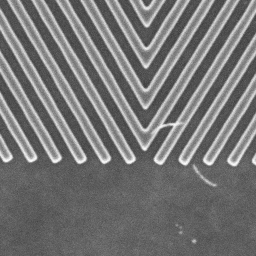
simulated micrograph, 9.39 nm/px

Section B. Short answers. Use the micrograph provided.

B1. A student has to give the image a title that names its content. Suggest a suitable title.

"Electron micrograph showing groups of lines, slits or small figures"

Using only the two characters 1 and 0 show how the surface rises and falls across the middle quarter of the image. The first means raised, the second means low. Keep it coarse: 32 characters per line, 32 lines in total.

00110000110000110000100001100001
00111000111000111000000011100011
00011100011100011100000111000111
00011100001100011100000110000111
10001110001110001110001110001110
10000110000110000110011100001100
11000111000111000111111100011100
11000011000011000011111000111000
11100011100011100011110000111000
01100001110001100001110001110001
01110000110001110000100001100001
00111000111000111000000011100011
00011000011000011000000111000011
00011100001100011100001110000111
00001110001100001110001110001110
10000110001110001110011110011100
10000111000111000111111000011100
11000011000111000011111000111000
11100011100011100011110000110000
01100001100001100001110001110001
01110001110001110001100001100001
00110000110000110000000011100011
00111000011000111000000111000111
00011000011000011000000110000111
00001000000000001000000110000110
00000000000000000000000000000000
00000000000000000000000000000000
00000000000000000000000000000000
00000000000000000000000000000000
00000000000000000000000000000000
00000000000000000000000000000000
00000000000000000000000000000000